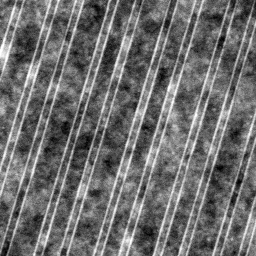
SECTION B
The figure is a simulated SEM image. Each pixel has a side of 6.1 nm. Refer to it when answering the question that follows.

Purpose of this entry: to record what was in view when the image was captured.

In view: parallel lines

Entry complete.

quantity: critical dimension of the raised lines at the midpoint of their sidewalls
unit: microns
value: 0.0482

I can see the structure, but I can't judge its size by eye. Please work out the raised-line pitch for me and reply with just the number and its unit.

0.174 um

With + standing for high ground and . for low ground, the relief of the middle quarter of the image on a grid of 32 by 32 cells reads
.......++....++.......++....++..
......++....+++......++.....+...
......++....++.......++....++...
......++....++.......++....++...
.....++.....++......++.....++...
.....++....++.......++....++....
.....++....++.......++....++....
....+++....++......++.....++....
....++....+++......++.....++....
....++....++.......++....++.....
....++....++.......++....++.....
....+....+++......++.....++.....
...++....++.......++....++......
...++....++.......++....++......
...+.....++......++.....++......
..++....++.......++....++.......
..++....++.......++....++.......
.+++....++......++.....++......+
.++.....++......++.....++......+
.++....++.......++....++.......+
.++....++.......++....++......++
++....+++......++.....+.......++
++....++.......++....++.......++
++....++.......++....++.......+.
+.....++......++.....++......++.
+....+++......++....++.......++.
+....++.......++....++.......++.
+....++......++.....++......++..
.....+.......++.....+.......++..
....++.......++....++.......++..
....++.......++....++......++...
....++......++.....++......++...